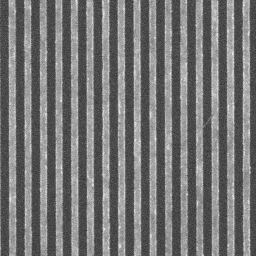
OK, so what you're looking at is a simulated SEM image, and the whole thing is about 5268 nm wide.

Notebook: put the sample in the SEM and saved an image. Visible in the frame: parallel lines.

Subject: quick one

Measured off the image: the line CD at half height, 6.25 pixels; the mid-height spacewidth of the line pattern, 0.193 um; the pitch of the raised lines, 321 nanometers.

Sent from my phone